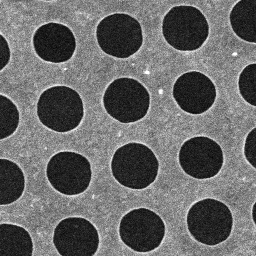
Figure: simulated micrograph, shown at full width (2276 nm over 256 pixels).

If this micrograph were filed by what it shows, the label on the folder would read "a regular array of holes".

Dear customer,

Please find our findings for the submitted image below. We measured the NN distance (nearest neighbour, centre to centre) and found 576 nanometres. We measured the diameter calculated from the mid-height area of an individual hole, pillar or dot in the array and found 409 nanometers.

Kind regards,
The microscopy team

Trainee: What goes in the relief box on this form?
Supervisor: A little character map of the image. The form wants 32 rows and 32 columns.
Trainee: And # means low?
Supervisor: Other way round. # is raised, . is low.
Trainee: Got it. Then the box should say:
#############################...
#####################....####...
#############....###......###...
#####....###......##......###...
####.....###......##......####..
.###......##......###....#######
.###.....####....###############
.#####..########################
###############################.
#######################...####..
##############....####.....###..
#####.....###......###.....###..
.####.....###......###.....####.
..###.....###......####...######
..###.....####....##############
..###.....######################
..#####.#######################.
#######################....####.
###############....####.....###.
#######...####.....###......###.
..####.....###......##......###.
...###.....###......###....#####
...###.....####....#############
...####....#####..##############
...#############################
.#######################....####
################...#####.....###
########...####.....###......###
...####.....###......###.....###
....###.....###......###.....###
....###.....####....######.#####
....###.....#####.##############